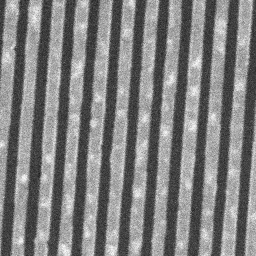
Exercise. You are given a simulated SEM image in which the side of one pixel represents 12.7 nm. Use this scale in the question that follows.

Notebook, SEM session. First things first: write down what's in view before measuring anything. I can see parallel lines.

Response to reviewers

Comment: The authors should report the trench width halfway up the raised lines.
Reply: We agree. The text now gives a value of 0.152 microns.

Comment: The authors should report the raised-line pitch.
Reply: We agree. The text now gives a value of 23.3 px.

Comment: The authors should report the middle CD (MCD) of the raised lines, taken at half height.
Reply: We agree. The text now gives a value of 0.141 um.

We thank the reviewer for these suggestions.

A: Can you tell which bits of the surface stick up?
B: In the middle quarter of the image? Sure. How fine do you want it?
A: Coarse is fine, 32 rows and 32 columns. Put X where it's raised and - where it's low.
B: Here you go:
--XXX---XXX---XXX---XX---XXX----
--XXX---XX----XX----XX---XXX---X
--XXX---XX----XX----XX---XXX---X
--XXX---XXX---XX----XX---XXX---X
--XX----XX----XX---XXX---XXX---X
--XX----XX----XX---XXX---XXX---X
--XX----XX----XX---XXX---XXX---X
--XX---XXX---XXX---XXX---XXX---X
--XX---XXX---XXX---XXX---XX----X
--XX---XXX---XXX---XXX---XX----X
-XXX---XXX---XXX---XXX---XX----X
-XXX---XXX---XXX---XXX--XXX---XX
-XXX---XXX---XXX---XX----XX---XX
-XXX---XXX---XXX---XX----XX---XX
-XXX---XXX---XXX---XX---XXX---XX
-XXX---XXX---XX----XX---XXX---XX
-XXX---XXX---XX----XX---XXX---XX
-XXX---XXX---XX---XXX---XXX---XX
-XX----XX----XX---XXX---XXX---XX
-XX----XX----XX---XXX---XXX---XX
-XX----XX----XX---XXX---XXX---XX
-XX---XXX---XXX---XXX---XXX---XX
-XX---XXX---XXX---XXX---XX----XX
-XX---XXX---XXX---XXX---XX----XX
XXX---XXX---XXX---XXX---XX----XX
XXX---XXX---XXX---XX----XX---XXX
XXX---XXX---XXX---XX----XX---XXX
XXX---XXX---XXX---XX----XX---XXX
XXX---XXX---XXX---XX---XXX---XXX
XXX---XX----XX----XX---XXX---XXX
XXX---XX----XX----XX---XXX---XXX
XXX---XX----XX---XXX---XXX---XXX